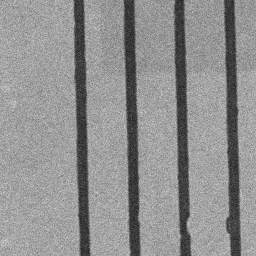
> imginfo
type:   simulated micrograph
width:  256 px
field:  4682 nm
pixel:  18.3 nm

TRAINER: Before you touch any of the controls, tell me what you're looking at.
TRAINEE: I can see parallel lines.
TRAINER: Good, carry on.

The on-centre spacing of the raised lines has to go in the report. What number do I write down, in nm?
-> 916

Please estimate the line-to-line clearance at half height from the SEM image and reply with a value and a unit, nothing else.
201 nm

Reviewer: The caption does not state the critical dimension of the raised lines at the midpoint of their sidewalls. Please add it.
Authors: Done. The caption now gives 708 nanometres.